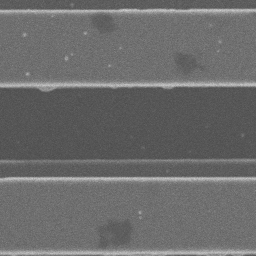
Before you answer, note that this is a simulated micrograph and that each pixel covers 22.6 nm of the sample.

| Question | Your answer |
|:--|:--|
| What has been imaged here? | lines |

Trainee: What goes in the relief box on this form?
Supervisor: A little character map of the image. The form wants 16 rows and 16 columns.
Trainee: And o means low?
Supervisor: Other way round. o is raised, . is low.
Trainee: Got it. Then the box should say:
oooooooooooooooo
oooooooooooooooo
oooooooooooooooo
oooooooooooooooo
oooooooooooooooo
..oo......o.....
................
................
................
................
oooooooooooooooo
oooooooooooooooo
oooooooooooooooo
oooooooooooooooo
oooooooooooooooo
oooooooooooooooo